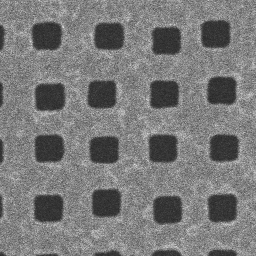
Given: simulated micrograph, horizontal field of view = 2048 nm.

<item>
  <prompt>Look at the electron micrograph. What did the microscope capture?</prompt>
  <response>a regular array of holes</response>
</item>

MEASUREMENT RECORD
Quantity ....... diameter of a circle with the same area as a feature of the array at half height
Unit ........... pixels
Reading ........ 31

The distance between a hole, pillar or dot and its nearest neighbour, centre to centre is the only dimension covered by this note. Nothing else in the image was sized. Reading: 0.431 µm